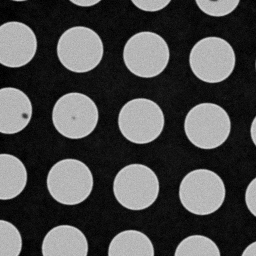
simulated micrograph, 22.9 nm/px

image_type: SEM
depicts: an array of small figures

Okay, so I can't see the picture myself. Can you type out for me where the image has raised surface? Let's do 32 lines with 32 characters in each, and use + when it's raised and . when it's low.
.........+++.....++++....+++++..
..........................+++...
................................
++++.....++.....................
++++....++++.....+++............
+++++..++++++...+++++....++++...
++++...++++++..++++++...+++++...
++++...++++++...+++++...+++++...
........++++....+++++...+++++...
.................++......++++...
................................
+++.............................
++++...++++......++.............
++++...+++++...+++++....++++....
++++...+++++...+++++...+++++....
+++....+++++...+++++...++++++...
++.....++++....+++++...++++++..+
................+++.....++++....
.........................++.....
++..............................
+++....++++.....................
+++...+++++....++++.....+++.....
+++...++++++..++++++...+++++....
+++...+++++...++++++..++++++...+
++.....++++...++++++..++++++...+
........+......++++....+++++...+
........................+++....+
................................
++.....++.......................
+++...+++++....+++......+.......
+++..++++++...+++++...+++++....+
++...++++++...+++++...+++++....+